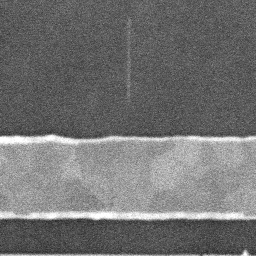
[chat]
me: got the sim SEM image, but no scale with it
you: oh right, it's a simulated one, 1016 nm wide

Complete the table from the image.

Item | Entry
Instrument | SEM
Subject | one or a few lines or trenches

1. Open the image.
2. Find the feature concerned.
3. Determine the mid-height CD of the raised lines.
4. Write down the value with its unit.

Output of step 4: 80.2 pixels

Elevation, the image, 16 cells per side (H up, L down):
LLLLLLLLLLLLLLLL
LLLLLLLLLLLLLLLL
LLLLLLLLLLLLLLLL
LLLLLLLLLLLLLLLL
LLLLLLLLLLLLLLLL
LLLLLLLLLLLLLLLL
LLLLLLLLLLLLLLLL
LLLLLLLLLLLLLLLL
LLLLLLLLLLLLLLLL
HHHHHHHHHHHHHHHH
HHHHHHHHHHHHHHHH
HHHHHHHHHHHHHHHH
HHHHHHHHHHHHHHHH
HHHHHHHHHHHHHHHH
LLLLLLLLLLLLLLLL
LLLLLLLLLLLLLLLL